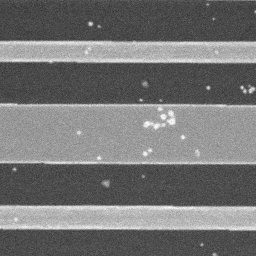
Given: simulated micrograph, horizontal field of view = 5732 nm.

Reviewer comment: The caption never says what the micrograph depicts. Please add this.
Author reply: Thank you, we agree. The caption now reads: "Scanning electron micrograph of lines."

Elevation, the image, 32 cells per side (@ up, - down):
--------------------------------
--------------------------------
--------------------------------
--------------------------------
--------------------------------
@@@@@@@@@@@@@@@@@@@@@@@@@@@@@@@@
@@@@@@@@@@@@@@@@@@@@@@@@@@@@@@@@
@@@@@@@@@@@@@@@@@@@@@@@@@@@@@@@@
--------------------------------
--------------------------------
--------------------------------
--------------------------------
--------------------------------
@@@@@@@@@@@@@@@@@@@@@@@@@@@@@@@@
@@@@@@@@@@@@@@@@@@@@@@@@@@@@@@@@
@@@@@@@@@@@@@@@@@@@@@@@@@@@@@@@@
@@@@@@@@@@@@@@@@@@@@@@@@@@@@@@@@
@@@@@@@@@@@@@@@@@@@@@@@@@@@@@@@@
@@@@@@@@@@@@@@@@@@@@@@@@@@@@@@@@
@@@@@@@@@@@@@@@@@@@@@@@@@@@@@@@@
--------------------------------
--------------------------------
--------------------------------
--------------------------------
--------------------------------
--------------------------------
@@@@@@@@@@@@@@@@@@@@@@@@@@@@@@@@
@@@@@@@@@@@@@@@@@@@@@@@@@@@@@@@@
----------------------------@@@@
--------------------------------
--------------------------------
--------------------------------